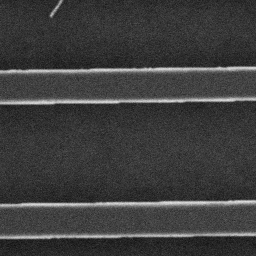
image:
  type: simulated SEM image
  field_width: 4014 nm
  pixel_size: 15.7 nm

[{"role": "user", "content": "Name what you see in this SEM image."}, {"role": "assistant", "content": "lines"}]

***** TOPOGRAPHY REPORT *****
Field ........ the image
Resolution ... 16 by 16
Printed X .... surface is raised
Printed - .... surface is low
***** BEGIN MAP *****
----------------
----------------
----------------
----------------
XXXXXXXXXXXXXXXX
XXXXXXXXXXXXXXXX
----------------
----------------
----------------
----------------
----------------
----------------
----------------
XXXXXXXXXXXXXXXX
XXXXXXXXXXXXXXXX
----------------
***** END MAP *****